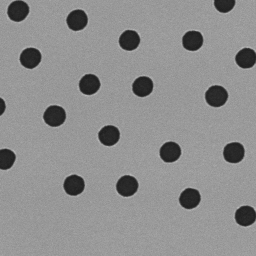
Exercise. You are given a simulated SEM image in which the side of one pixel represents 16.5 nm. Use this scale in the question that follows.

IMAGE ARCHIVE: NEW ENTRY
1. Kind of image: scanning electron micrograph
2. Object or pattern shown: a regular array of holes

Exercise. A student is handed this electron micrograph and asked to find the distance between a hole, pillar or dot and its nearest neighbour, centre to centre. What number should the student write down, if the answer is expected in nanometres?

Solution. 874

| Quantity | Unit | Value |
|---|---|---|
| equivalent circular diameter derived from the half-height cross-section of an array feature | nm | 355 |